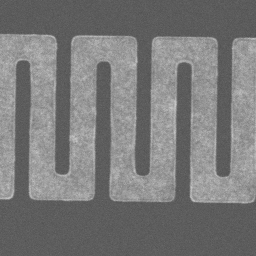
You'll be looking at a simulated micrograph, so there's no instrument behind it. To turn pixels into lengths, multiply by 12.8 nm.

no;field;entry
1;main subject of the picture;groups of lines, slits or small figures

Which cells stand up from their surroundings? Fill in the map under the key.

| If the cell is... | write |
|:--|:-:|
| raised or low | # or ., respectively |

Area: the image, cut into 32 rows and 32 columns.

................................
................................
................................
................................
######..........................
#######..########..########..###
#######..########..########..###
##.####..########..########..###
##..###..###..###..###..###..###
##..###..###..###..###..###..###
##..###..###..###..###..###..###
##..###..###..###..###..###..###
##..###..###..###..###..###..###
##..###..###..###..###..###..###
##..###..###..###..###..###..###
##..###..###..###..###..###..###
##..###..###..###..###..###..###
##..###..###..###..###..###..###
##..###..###..###..###..###..###
##..###..###..###..###..###..###
##..###..###..###..###..###..###
##..###..###..###..###..###..###
##..########..########..########
##..########..########..########
#...########..########..########
................................
................................
................................
................................
................................
................................
................................